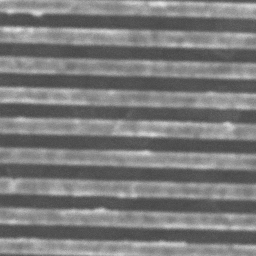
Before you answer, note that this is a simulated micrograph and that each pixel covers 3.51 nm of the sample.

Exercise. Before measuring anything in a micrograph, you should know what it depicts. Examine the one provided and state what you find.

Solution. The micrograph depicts parallel lines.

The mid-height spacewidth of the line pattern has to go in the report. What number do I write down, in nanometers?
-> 55.3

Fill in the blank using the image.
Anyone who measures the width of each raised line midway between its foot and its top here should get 49.1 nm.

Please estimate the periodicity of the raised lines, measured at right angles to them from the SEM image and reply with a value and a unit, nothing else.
106 nanometres